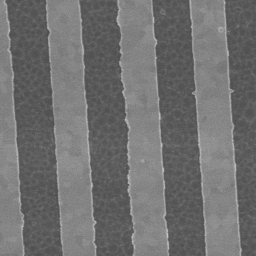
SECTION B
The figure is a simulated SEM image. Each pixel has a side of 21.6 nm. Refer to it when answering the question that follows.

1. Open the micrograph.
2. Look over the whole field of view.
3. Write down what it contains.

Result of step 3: one or a few lines or trenches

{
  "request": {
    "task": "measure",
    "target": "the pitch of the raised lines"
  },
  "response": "1560 nm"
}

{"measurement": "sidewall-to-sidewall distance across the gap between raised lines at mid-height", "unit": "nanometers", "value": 833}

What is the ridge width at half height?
728 nm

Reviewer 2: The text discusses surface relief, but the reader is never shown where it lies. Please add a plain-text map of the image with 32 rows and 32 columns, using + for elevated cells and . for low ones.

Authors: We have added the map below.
+.....++++.....++++.....++++....
+.....++++.....++++.....++++....
+.....++++.....++++.....++++....
+.....++++.....++++.....++++....
+.....++++.....++++.....++++....
+.....++++.....++++++...++++....
+...+.++++....+++++.....++++....
+.....++++.....++++.....+++++...
++....++++.....+++++....+++++...
++....++++.....+++++....+++++...
++....+++++....+++++....+++++...
++.....++++....+++++....+++++..+
++.....++++.....++++....+++++...
++.....++++.....++++.....++++.+.
++.....++++.....++++.....++++..+
++.....++++.....++++.....++++...
++.....++++.....++++.....++++...
++.....++++.....++++.....++++...
++.....+++++....++++.....++++...
++.....++++.....++++.....++++...
++.....++++.....++++.....++++...
++.....++++.....++++.....++++...
++.....++++.....++++.....++++...
++.....++++.....+++++....+++++..
++.....++++.....+++++....+++++..
+++....+++++....+++++....+++++..
+++.....++++....+++++....+++++..
+++.....++++.....++++.....++++..
+++.....++++.....++++.....++++..
+++.....++++.....++++.....++++..
+++.....++++.....++++.....++++..
+++.....++++.....++++.....++++..